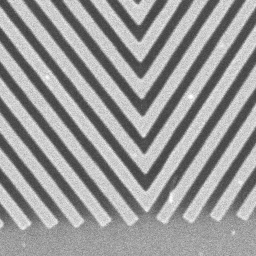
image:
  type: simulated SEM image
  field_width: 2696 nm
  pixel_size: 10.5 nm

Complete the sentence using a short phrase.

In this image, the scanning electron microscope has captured groups of lines, slits or small figures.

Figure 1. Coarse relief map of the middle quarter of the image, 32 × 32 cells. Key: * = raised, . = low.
**....***....***......***...****
***....***...****....****...***.
****...****...****...***...***..
.****...****...****.***...****..
..***....***....*******...***...
...***....***....*****...***....
....***...****...****....***...*
*...****...****...**....***...**
**...****...****...*...***....**
***...****...***.......***...***
***....***....***.....***...****
.***....***...****...***....***.
.****...****...****..***...***..
..****...****...*******...****..
...***....***....******...***...
....***....***....****...***....
*...****....***...***...****...*
**...****...****...**...***...**
***...****...***.......***....**
***....***....***.....****...***
.***....***....***....***...****
.****...****...****..****..****.
..****...****...********...***..
...****...****...******...****..
*...***....***....*****...***...
*....***....***....***...***....
**...****...****...**...****...*
***...****...****.......***...**
****...****...***......***....**
.***....***....***....***....***
..***...****...****...***...****
...***...****...****.***...****.